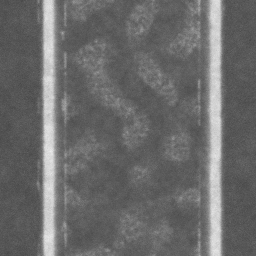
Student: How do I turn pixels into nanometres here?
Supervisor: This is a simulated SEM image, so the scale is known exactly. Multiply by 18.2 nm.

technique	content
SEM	one or a few lines or trenches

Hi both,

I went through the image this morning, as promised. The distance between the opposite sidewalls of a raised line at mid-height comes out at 3010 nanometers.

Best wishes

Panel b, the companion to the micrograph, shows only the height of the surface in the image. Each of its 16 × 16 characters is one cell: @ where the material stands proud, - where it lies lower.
---@@@@@@@@@@---
---@@@@@@@@@@---
---@@@@@@@@@@---
---@@@@@@@@@@---
---@@@@@@@@@@---
---@@@@@@@@@@---
---@@@@@@@@@@---
---@@@@@@@@@@---
---@@@@@@@@@@---
---@@@@@@@@@@---
---@@@@@@@@@@---
---@@@@@@@@@@---
---@@@@@@@@@@---
---@@@@@@@@@@---
---@@@@@@@@@@---
---@@@@@@@@@@---